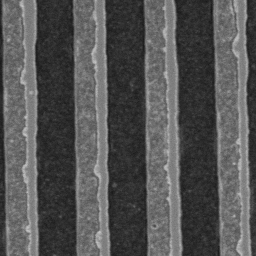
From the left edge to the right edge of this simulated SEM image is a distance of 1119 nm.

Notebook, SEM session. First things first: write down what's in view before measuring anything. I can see lines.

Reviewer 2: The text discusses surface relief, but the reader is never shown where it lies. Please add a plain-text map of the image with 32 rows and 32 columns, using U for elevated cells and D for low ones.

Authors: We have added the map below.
UUUUDDDDDUUUUDDDDDUUUUDDDDDUUUUD
UUUUDDDDDUUUUDDDDDUUUUDDDDDUUUUD
UUUUDDDDDUUUUDDDDDUUUUDDDDDUUUUD
UUUUDDDDDUUUUDDDDDUUUUDDDDDUUUUD
UUUUDDDDDUUUUDDDDDUUUUDDDDDUUUUD
DUUUDDDDDUUUUDDDDDUUUUDDDDDUUUUD
DUUUDDDDDUUUUDDDDDUUUUDDDDDUUUUD
DUUUDDDDDUUUUDDDDDUUUUDDDDDUUUUD
UUUUDDDDDUUUUDDDDDUUUUDDDDDUUUUD
UUUUDDDDDUUUUDDDDDUUUUDDDDDUUUUD
DUUUDDDDDUUUUDDDDDUUUUDDDDDUUUUD
DUUUUDDDDUUUUDDDDDUUUUDDDDDUUUUD
DUUUUDDDDDUUUDDDDDUUUUDDDDDUUUUD
DUUUUDDDDDUUUDDDDDUUUUDDDDDUUUUD
DUUUUDDDDDUUUDDDDDUUUUDDDDDUUUUD
DUUUUDDDDDUUUDDDDDUUUUDDDDDUUUUD
DUUUUDDDDDUUUDDDDDUUUUDDDDDUUUUD
DUUUDDDDDDUUUDDDDDUUUUDDDDDUUUUD
DUUUDDDDDDUUUDDDDDUUUUDDDDDUUUUD
DUUUDDDDDDUUUDDDDDUUUUDDDDDUUUUD
DUUUDDDDDDUUUDDDDDUUUUDDDDDUUUUD
DUUUUDDDDDUUUDDDDDUUUUDDDDDUUUUD
DUUUUDDDDDUUUUDDDDUUUUDDDDDUUUUD
DUUUDDDDDDUUUDDDDDUUUUDDDDDUUUUD
DUUUUDDDDDUUUDDDDDUUUUDDDDDUUUUD
DUUUUDDDDDUUUDDDDDUUUUDDDDDDUUUD
DUUUUDDDDDUUUDDDDDDUUUDDDDDDUUUD
DUUUUDDDDDUUUDDDDDDUUUDDDDDDUUUD
DUUUUDDDDDUUUUDDDDDUUUDDDDDDUUUD
DUUUUDDDDDUUUUDDDDDUUUUDDDDDUUUD
DUUUUDDDDDUUUUDDDDDUUUUDDDDDUUUD
DUUUUDDDDDUUUUDDDDDUUUUDDDDDUUUD